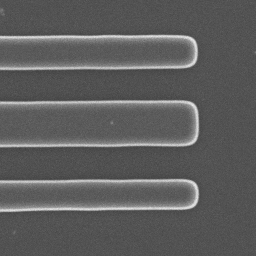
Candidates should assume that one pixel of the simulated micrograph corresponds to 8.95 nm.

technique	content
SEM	groups of lines, slits or small figures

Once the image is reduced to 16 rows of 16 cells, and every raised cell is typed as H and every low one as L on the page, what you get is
LLLLLLLLLLLLLLLL
LLLLLLLLLLLLLLLL
HHHHHHHHHHHHLLLL
HHHHHHHHHHHHLLLL
LLLLLLLLLLLLLLLL
LLLLLLLLLLLLLLLL
HHHHHHHHHHHHLLLL
HHHHHHHHHHHHLLLL
HHHHHHHHHHHHLLLL
LLLLLLLLLLLLLLLL
LLLLLLLLLLLLLLLL
HHHHHHHHHHHHLLLL
HHHHHHHHHHHHLLLL
LLLLLLLLLLLLLLLL
LLLLLLLLLLLLLLLL
LLLLLLLLLLLLLLLL